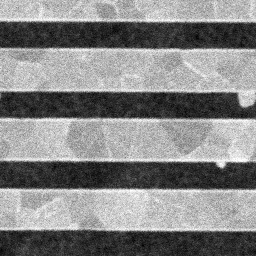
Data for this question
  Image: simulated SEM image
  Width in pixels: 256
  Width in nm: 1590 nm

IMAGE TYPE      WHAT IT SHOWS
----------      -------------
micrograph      one or a few lines or trenches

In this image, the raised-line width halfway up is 246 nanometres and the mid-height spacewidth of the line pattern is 183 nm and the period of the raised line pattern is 433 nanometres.